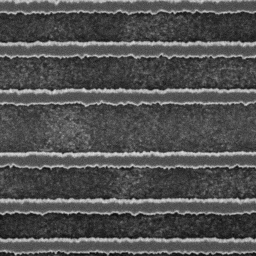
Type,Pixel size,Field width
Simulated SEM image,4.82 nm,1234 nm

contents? lines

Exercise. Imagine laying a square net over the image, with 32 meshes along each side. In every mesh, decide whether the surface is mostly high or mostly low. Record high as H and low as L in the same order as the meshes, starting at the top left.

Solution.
HHHHHHHHHHHHHHHHHHHHHHHHHHHHHHHH
HHHHHHHHHHHHHHHHHHHHHHHLHHHHHHLH
LLLLLLLLLLLLLLLLLLLLLLLLLLLLLLLL
LLLLLLLLLLLLLLLLLLLLLLLLLLLLLLLL
LLLLLLLLLLLLLLLLLLLLLLLLLLLLLLLL
HHHHHHHHHHHHHHHHHHHHHHHHHHHHHHHH
HHHHHHHHHHHHHHHHHHHHHHHHHHHHHHHH
LLLLLLLLLLLLLLLLLLLLLLLLLLLLLLLL
LLLLLLLLLLLLLLLLLLLLLLLLLLLLLLLL
LLLLLLLLLLLLLLLLLLLLLLLLLLLLLLLL
LLLLLLLLLLLLLLLLLLLLLLLLLLLLLLLL
HHHHHHHHHHHHHHHHHHHHHHHHHHHHHHHH
HHHHHHHHHHHHHHHHHHHHHHHHHHHHHHHH
LLLLLLLLLLLLLLLLLLLLLLLLLLLLLLLL
LLLLLLLLLLLLLLLLLLLLLLLLLLLLLLLL
LLLLLLLLLLLLLLLLLLLLLLLLLLLLLLLL
LLLLLLLLLLLLLLLLLLLLLLLLLLLLLLLL
LLLLLLLLLLLLLLLLLLLLLLLLLLLLLLLL
LLLLLLLLLLLLLLLLLLLLLLLLLLLLLLLL
HHHHHHHHHHHHHHHHHHHHHHHHHHHHHHHH
HHHHHHHHHHHHHHHHHHHHHHHHHHHHHHHH
LLLLLLLLLLLLLLLLLLLLLLLLLLLLLLLL
LLLLLLLLLLLLLLLLLLLLLLLLLLLLLLLL
LLLLLLLLLLLLLLLLLLLLLLLLLLLLLLLL
LLLLLLLLLLLLLLLLLLLLLLLLLLLLLLLL
HHHHHHHHHHHHHHHHHHHHHHHHHHHHHHHH
HHHHHHHHHHHHHHHHHHHHHHHHHHHHHHHH
LLLLLLLLLLLLLLLLLLLLLLLLLLLLLLLL
LLLLLLLLLLLLLLLLLLLLLLLLLLLLLLLL
LLLLLLLLLLLLLLLLLLLLLLLLLLLLLLLL
HHHHHHHHHHHHHHHHHHHHHHHHHHHHHHHH
LHHHHHLLHHHHHHHHHHHHHHHHHHHHHHHH